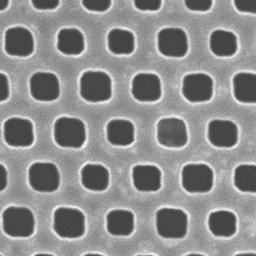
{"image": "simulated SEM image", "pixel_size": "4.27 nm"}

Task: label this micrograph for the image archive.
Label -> a regular array of holes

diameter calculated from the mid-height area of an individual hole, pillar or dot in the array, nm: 126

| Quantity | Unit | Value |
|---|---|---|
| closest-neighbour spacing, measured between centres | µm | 0.217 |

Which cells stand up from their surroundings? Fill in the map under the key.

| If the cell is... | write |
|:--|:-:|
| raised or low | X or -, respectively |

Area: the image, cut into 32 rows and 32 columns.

-XXX---XXX----XXX---XXX---XXX---
XXXXXXXXXXXXXXXXXXXXXXXXXXXXXXX-
XXXXXXXXXXXXXXXXXXXXXXXXXXXXXXXX
XX-XXXXXXXXXXXXXXXXXX-XXXXXXXXXX
X---XXX---XXXX---XXX---XXX---XXX
X---XXX---XXXX---XXX---XXX---XXX
X---XXXX--XXXX--XXXX---XXXX--XXX
XXXXXXXXXXXXXXXXXXXXXXXXXXXXXXXX
XXXXXXXXXXXXXXXXXXXXXXXXXXXXXXXX
-XXX---XXX---XXXX---XXX---XXX---
-XXX---XXX----XXX---XXX----XX---
-XXX---XXX----XXX---XXX---XXX---
XXXXX--XXXX--XXXX--XXXXX--XXXX--
XXXXXXXXXXXXXXXXXXXXXXXXXXXXXXXX
XXXXXXXXXXXXXXXXXXXXXXXXXXXXXXXX
X---XXX---XXXX--XXXXX--XXX---XXX
X---XXX----XX----XXX---XXX----XX
X---XXX----XXX---XXX---XXX----XX
XXXXXXXXXXXXXXXXXXXXXXXXXXXXXXXX
XXXXXXXXXXXXXXXXXXXXXXXXXXXXXXXX
XXXX--XXXXXXXXXXXXXXXXXXXXXXXXXX
-XXX---XXX---XXXX---XXX----XX---
-XXX---XXX---XXXX---XXX----XX---
-XXX---XXXX--XXXX---XXX---XXXX--
XXXXXXXXXXXXXXXXXXXXXXXXXXXXXXXX
XXXXXXXXXXXXXXXXXXXXXXXXXXXXXXXX
X---XXX---XXXX--XXXX---XXXX--XXX
----XXX---XXX----XXX---XXX---XXX
----XXX---XXX----XXX---XXX---XXX
X---XXXX--XXXXXXXXXX---XXXXXXXXX
XXXXXXXXXXXXXXXXXXXXXXXXXXXXXXXX
XXXXXXXXXXXXXXXXXXXXXXXXXXXXXXXX